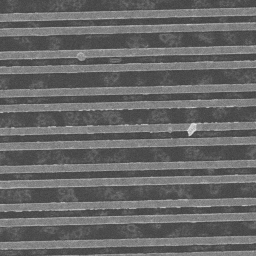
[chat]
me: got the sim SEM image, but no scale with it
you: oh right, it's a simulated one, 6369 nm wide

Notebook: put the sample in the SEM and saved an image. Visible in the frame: parallel lines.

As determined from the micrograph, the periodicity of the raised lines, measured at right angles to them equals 473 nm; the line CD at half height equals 0.18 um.